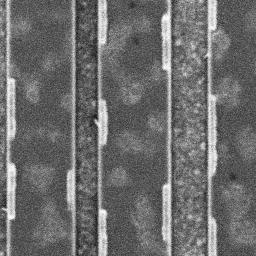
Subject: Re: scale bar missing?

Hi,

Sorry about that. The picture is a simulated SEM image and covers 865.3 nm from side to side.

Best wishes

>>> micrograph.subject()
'one or a few lines or trenches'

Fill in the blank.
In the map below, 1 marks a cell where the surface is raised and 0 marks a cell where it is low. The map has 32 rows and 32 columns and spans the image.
01111111100011111111100000111111
01111111100011111111100000111111
01111111100011111111100000111111
01111111100011111111100000111111
01111111100011111111100000111111
01111111100011111111100000111111
01111111100011111111100000111111
01111111100011111111100000111111
01111111100011111111100000111111
01111111100011111111100000111111
01111111100011111111100000111111
01111111100011111111100000111111
01111111100011111111100000111111
01111111100011111111100000111111
01111111100011111111100000111111
01111111100011111111100000111111
01111111100011111111100000111111
01111111100011111111100000111111
01111111100011111111100000111111
01111111100011111111100000111111
01111111100011111111100000111111
01111111100011111111100000111111
01111111100011111111100000111111
01111111100011111111100000111111
01111111100011111111100000111111
01111111100011111111100000111111
01111111100011111111100000111111
01111111100011111111100000111111
01111111100011111111100000111111
01111111100011111111100000111111
01111111100011111111100000111111
01111111100011111111100000111111